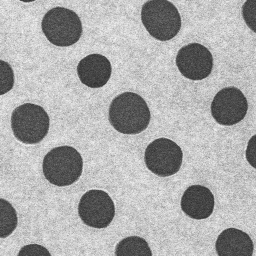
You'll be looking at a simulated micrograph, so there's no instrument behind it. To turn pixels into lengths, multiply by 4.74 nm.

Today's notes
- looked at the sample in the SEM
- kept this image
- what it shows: a regular array of holes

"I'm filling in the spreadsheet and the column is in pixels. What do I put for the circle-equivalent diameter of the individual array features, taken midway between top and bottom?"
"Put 37.7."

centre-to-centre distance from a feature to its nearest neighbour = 0.26 microns